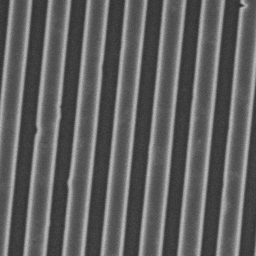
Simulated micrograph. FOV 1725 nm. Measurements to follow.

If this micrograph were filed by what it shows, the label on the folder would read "parallel lines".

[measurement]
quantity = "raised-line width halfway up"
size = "0.136 micrometres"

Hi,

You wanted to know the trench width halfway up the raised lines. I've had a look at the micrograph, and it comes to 0.124 microns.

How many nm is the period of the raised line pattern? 258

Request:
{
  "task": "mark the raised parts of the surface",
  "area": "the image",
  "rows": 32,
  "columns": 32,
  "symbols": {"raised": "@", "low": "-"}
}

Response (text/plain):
-@@@--@@@--@@---@@---@@--@@@--@@
-@@@--@@@--@@---@@--@@@--@@@--@@
-@@@--@@---@@---@@--@@@--@@@--@@
-@@@--@@---@@--@@@--@@@--@@@--@@
-@@---@@---@@--@@@--@@@--@@---@@
-@@---@@---@@--@@@--@@@--@@---@@
-@@---@@--@@@--@@@--@@@--@@---@@
-@@---@@--@@@--@@---@@---@@---@@
-@@--@@@--@@@--@@---@@---@@--@@@
@@@--@@@--@@@--@@---@@--@@@--@@@
@@@--@@@--@@---@@---@@--@@@--@@@
@@@--@@@--@@---@@---@@--@@@--@@@
@@@--@@@--@@---@@--@@@--@@@--@@@
@@@--@@---@@---@@--@@@--@@@--@@-
@@---@@---@@--@@@--@@@--@@---@@-
@@---@@---@@--@@@--@@@--@@---@@-
@@---@@--@@@--@@@--@@@--@@---@@-
@@---@@--@@@--@@@--@@---@@---@@-
@@--@@@--@@@--@@---@@---@@--@@@-
@@--@@@--@@@--@@---@@---@@--@@@-
@@--@@@--@@---@@---@@--@@@--@@@-
@@--@@@--@@---@@--@@@--@@@--@@@-
@@--@@@--@@---@@--@@@--@@@--@@@-
@@--@@---@@---@@--@@@--@@@--@@--
@---@@---@@--@@@--@@@--@@@--@@--
@---@@---@@--@@@--@@@--@@---@@--
@---@@--@@@--@@@--@@@--@@---@@--
@---@@--@@@--@@@--@@---@@---@@--
@--@@@--@@@--@@---@@---@@---@@--
@--@@@--@@@--@@---@@---@@--@@@--
@--@@@--@@@--@@---@@--@@@--@@@--
@--@@@--@@---@@---@@--@@@--@@@--